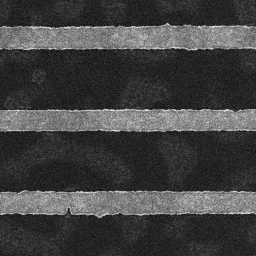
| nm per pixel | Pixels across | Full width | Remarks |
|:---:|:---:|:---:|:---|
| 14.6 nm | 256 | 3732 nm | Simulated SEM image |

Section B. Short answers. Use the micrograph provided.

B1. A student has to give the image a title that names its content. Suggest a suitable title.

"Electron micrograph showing one or a few lines or trenches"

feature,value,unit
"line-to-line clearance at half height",893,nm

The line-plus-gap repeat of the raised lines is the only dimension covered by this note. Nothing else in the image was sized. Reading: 1200 nanometres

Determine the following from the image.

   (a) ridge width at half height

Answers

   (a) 0.32 microns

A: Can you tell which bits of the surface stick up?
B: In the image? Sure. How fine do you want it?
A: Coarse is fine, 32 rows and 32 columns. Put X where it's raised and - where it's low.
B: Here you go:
--------------------------------
--------------------------------
--------------------------------
XXXXXXXXXXXXXXXXXXXXXXXXXXXXXXXX
XXXXXXXXXXXXXXXXXXXXXXXXXXXXXXXX
XXXXXXXXXXXXXXXXXXXXXXXXXXXXXXXX
--------------------------------
--------------------------------
-------------------------------X
----X---------------------------
--------------------------------
--------------------------------
-X------------------------------
--------------------------------
XXXXXXXXXXXXXXXXXXXXXXXXXXXXXXXX
XXXXXXXXXXXXXXXXXXXXXXXXXXXXXXXX
-----XX-------------------------
-----XX-------------------------
----XX--------------------------
---X-X--------------------------
--------------------------------
--------------------------------
--------------------------------
--------------------------------
XXXXXXXXXXXXXXXXXXXXXXXXXXXXXXXX
XXXXXXXXXXXXXXXXXXXXXXXXXXXXXXXX
XXXXXXXX-XXXXXXXXXXXXXXXXXXXXXXX
--------------------------------
--------------------------------
--------------------------------
--------------------------------
--------------------------------